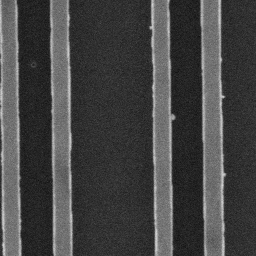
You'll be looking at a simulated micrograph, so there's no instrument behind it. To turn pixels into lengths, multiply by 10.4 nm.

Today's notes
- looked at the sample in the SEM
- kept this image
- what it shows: lines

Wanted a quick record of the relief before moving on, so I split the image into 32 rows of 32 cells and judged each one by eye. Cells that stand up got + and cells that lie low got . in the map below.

++....+++..........++....+++....
++....+++..........++....+++....
++....+++..........++....+++....
++....+++..........++....+++....
++....+++..........++....+++....
++....+++..........++....+++....
++....+++..........++....+++....
++....+++..........++....+++....
++....+++..........++....+++....
++....+++..........++....+++....
++....+++..........++....+++....
++....+++..........++....+++....
++.....++..........++....+++....
++....+++..........++....+++....
++.....++..........++....+++....
++.....++..........++....+++....
++.....++..........++....+++....
++.....++..........++....+++....
++.....++..........++....+++....
++.....++..........++....+++....
++.....++..........++....+++....
++.....++..........++....+++....
++.....++..........++....+++....
++.....++..........++....+++....
++.....++..........++....+++....
++.....++..........++....+++....
++.....++..........++....+++....
+++....++..........++....+++....
+++....++..........++.....++....
+++....++..........++.....++....
+++....++..........++.....++....
+++....++..........++.....++....